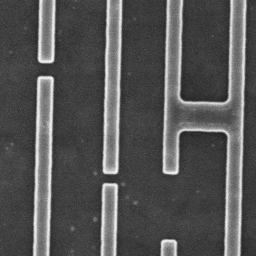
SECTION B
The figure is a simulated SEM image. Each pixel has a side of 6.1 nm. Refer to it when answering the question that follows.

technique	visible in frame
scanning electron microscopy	parallel lines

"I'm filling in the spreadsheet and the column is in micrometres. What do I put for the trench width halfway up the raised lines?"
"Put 0.307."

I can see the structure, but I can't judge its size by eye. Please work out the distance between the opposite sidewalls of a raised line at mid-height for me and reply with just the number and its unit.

0.0846 microns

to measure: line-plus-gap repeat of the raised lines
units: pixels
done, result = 63.4